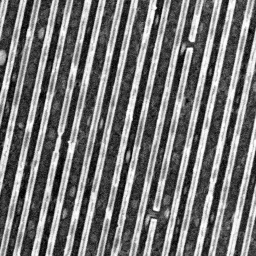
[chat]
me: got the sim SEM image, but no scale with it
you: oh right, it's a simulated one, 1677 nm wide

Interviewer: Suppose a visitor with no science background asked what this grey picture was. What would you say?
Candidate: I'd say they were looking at parallel lines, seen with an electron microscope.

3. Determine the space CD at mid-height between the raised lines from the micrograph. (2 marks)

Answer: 60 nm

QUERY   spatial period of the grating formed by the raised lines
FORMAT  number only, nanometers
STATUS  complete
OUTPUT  104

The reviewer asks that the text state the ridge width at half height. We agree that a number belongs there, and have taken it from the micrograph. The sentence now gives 35.3 nanometers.